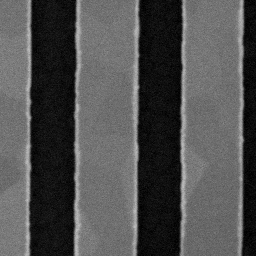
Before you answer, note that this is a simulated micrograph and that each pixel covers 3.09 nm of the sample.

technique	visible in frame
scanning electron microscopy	lines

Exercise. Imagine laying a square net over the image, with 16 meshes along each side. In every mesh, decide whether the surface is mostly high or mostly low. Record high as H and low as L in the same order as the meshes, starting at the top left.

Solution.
HHLLLHHHHLLHHHHL
HHLLLHHHHLLHHHHL
HHLLLHHHHLLHHHHL
HHLLLHHHHLLHHHHL
HHLLLHHHHLLHHHHL
HHLLLHHHHLLHHHHL
HHLLLHHHHLLHHHHL
HHLLLHHHHLLHHHHL
HHLLLHHHHLLHHHHL
HHLLLHHHHLLHHHHL
HHLLLHHHHLLHHHHL
HHLLLHHHHLLHHHHL
HHLLLHHHHLLHHHHL
HHLLLHHHHLLHHHHL
HHLLLHHHHLLHHHHL
HHLLLHHHHLLHHHHL